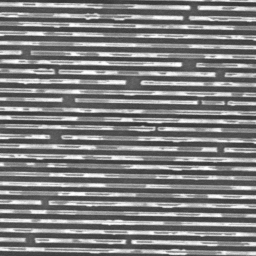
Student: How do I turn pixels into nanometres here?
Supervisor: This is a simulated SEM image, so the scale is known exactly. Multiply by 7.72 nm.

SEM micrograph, parallel lines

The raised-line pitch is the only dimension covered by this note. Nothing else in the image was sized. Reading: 72.7 nanometers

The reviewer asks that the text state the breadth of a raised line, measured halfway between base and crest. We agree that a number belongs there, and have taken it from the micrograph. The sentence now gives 0.029 micrometres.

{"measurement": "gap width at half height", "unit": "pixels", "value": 5.62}